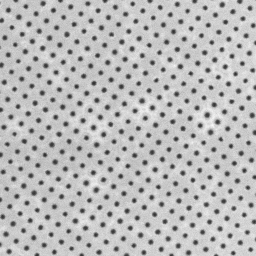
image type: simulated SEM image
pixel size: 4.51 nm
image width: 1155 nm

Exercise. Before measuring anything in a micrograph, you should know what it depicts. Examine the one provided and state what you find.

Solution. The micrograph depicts a regular array of holes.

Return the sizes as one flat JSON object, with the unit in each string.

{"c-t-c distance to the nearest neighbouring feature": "55 nm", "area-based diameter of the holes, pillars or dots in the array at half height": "0.0216 µm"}